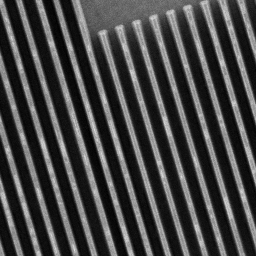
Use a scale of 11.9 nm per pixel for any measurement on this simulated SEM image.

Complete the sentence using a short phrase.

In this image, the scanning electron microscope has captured parallel lines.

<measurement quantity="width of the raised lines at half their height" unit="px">7.06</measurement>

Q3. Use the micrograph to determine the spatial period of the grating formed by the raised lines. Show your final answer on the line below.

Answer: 211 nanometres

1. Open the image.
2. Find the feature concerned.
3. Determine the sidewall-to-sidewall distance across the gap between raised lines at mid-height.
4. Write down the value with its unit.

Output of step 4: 0.127 um